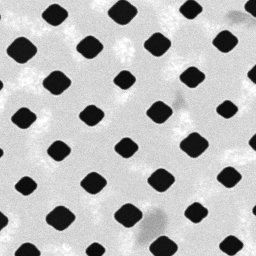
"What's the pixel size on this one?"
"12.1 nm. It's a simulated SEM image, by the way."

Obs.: a regular array of holes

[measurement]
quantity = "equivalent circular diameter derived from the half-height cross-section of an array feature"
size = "276 nanometers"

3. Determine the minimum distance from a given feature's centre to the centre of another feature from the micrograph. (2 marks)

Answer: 577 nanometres